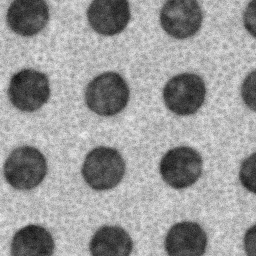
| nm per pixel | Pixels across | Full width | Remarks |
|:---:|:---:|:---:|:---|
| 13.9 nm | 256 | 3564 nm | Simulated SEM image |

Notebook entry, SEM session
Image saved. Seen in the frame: holes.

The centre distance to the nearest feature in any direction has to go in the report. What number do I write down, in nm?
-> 1040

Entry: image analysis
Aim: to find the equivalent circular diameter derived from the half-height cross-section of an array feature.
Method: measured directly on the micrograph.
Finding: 609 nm